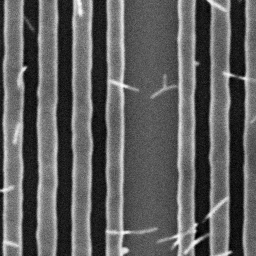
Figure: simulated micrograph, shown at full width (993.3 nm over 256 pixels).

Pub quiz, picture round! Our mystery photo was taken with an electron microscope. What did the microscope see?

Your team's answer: groups of lines, slits or small figures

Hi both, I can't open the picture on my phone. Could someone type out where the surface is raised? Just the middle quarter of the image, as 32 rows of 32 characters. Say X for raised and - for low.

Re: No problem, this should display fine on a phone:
--XXXXX----XXXX--------------XXX
--XXXXX----XXXX--------------XXX
--XXXXX----XXXX--------------XXX
--XXXXX----XXXX--------------XXX
--XXXXX----XXXX--------------XXX
--XXXXX----XXXX--------------XXX
--XXXXX----XXXX--------------XXX
--XXXXX----XXXX--------------XXX
---XXXX----XXXX--------------XXX
--XXXXX----XXXX--------------XXX
--XXXXX----XXXX--------------XXX
--XXXXX----XXXX--------------XXX
--XXXXX----XXXX--------------XXX
--XXXXX----XXXX--------------XXX
--XXXXX----XXXX--------------XXX
--XXXXX----XXXX--------------XXX
--XXXXX----XXXX--------------XXX
--XXXXX----XXXX--------------XXX
--XXXXX----XXXX--------------XXX
--XXXXX----XXXX--------------XXX
--XXXXX----XXXX--------------XXX
--XXXXX----XXXX--------------XXX
---XXXX----XXXX--------------XXX
---XXXX----XXXX--------------XXX
---XXXX----XXXX--------------XXX
--XXXXX----XXXX--------------XXX
--XXXXX----XXXX--------------XXX
--XXXXX----XXXX--------------XXX
--XXXXX----XXXX--------------XXX
--XXXXX----XXXX--------------XXX
--XXXXX----XXX---------------XXX
--XXXXX----XXX---------------XXX